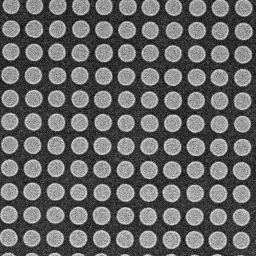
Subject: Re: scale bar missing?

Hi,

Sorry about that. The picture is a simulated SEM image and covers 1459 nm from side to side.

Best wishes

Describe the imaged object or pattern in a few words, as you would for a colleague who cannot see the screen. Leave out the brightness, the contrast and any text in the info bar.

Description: an array of small figures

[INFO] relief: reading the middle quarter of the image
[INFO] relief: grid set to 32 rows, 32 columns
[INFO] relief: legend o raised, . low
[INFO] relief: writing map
................................
..ooo....oo...ooo...ooo...oo....
..oooo..oooo..oooo..ooo..oooo..o
..oooo..oooo..oooo.ooooo.oooo..o
...oo...ooo...ooo...ooo...ooo..o
................................
................................
..oooo..ooo...ooo...ooo...ooo...
..oooo..oooo..oooo.oooo..oooo..o
..oooo..oooo..oooo.oooo..oooo..o
...oo...ooo...ooo...ooo...ooo..o
................................
................................
..oooo..ooo...ooo...ooo...ooo..o
..oooo..oooo..ooo..oooo..oooo..o
..oooo..oooo..ooo...ooo..oooo..o
...oo....oo....oo...ooo...oo...o
................................
...oo....o......................
..oooo..ooo...ooo...ooo..oooo..o
..oooo..oooo..ooo..oooo..oooo..o
..oooo..ooo...ooo..oooo..oooo..o
.........o.....o..........oo....
................................
..ooo....o.....o................
..oooo..ooo...ooo..oooo..oooo..o
..oooo..oooo.oooo..oooo..oooo..o
..ooo...ooo..oooo...ooo..oooo..o
.....................o....oo....
................................
..ooo....oo...ooo...oo....oo....
..oooo..oooo.oooo..oooo..oooo..o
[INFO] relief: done